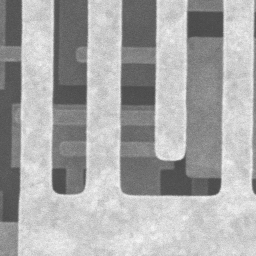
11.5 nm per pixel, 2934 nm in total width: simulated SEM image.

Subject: wiring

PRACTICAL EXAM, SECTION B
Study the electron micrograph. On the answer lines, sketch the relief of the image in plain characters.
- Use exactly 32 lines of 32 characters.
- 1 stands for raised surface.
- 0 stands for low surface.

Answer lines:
00011110000111100000111000001111
00011110000111100000111000001111
00011110000111100000111000001111
00011110000111100000111000001111
00011110000111100000111000001111
00011110000111100000111000001111
00011110000111100000111000001111
00011110000111100000111000001111
00011110000111100000111000001111
00011110000111100000111000001111
00011110000111100000111000001111
00011110000111100000111000001111
00011100000111100000111000001111
00011100000111100001111000001111
00011100000111100001111000001111
00011100000111100001111000001111
00011100000111100001111000001110
00011100000111100001111000001110
00011100000111100001111000001110
00011100000111100000111000001110
00011100000111100000000000001110
00011100000111100000000000001110
00011100000111100000000000001110
00011110000111100000000000001111
00111111111111111000000000111111
00111111111111111111111111111111
00111111111111111111111111111111
00111111111111111111111111111111
00111111111111111111111111111111
00111111111111111111111111111111
00111111111111111111111111111111
00111111111111111111111111111111